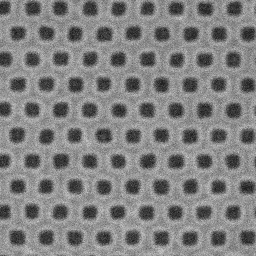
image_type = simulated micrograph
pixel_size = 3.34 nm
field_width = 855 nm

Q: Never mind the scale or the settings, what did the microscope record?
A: a regular array of holes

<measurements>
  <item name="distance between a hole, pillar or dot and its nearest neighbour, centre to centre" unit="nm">94.8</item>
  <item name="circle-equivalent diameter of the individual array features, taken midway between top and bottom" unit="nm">56.5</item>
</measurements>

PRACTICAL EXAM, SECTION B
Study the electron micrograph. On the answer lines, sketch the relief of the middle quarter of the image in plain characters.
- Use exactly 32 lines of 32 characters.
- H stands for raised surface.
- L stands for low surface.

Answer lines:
LHHHHLLLHHHHLLLHHHHLLLLHHHLLLLHH
HHHHHHHHHHHHHHHHHHHHHHHHHHHHHHHH
HHHHHHHHHHHHHHHHHHHHHHHHHHHHHHHH
HHLLHHHHLLLHHHHHLLLHHHHLLLHHHHLL
HLLLLHHHLLLLHHHLLLLHHHLLLLHHHLLL
HLLLLHHHLLLLHHHLLLLHHHLLLLHHHLLL
HLLLLHHHLLLHHHHLLLLHHHHLLLHHHHLL
HHHHHHHHHHHHHHHHHHHHHHHHHHHHHHHH
HHHHHHHHHHHHHHHHHHHHHHHHHHHHHHHH
HHHHHHHHHHHHHHHHHHHHHHHHHHHHHHHH
LHHHHLLLHHHHLLLLHHHLLLLHHHLLLLHH
LHHHLLLLLHHHLLLLHHHLLLLHHHLLLLHH
LHHHLLLLHHHHLLLLHHHLLLLHHHLLLLHH
HHHHHHLHHHHHHLLHHHHHLLHHHHHLLHHH
HHHHHHHHHHHHHHHHHHHHHHHHHHHHHHHH
HHHHHHHHHHHHHHHHHHHHHHHHHHHHHHHH
HLLLHHHHLLLLHHHHLLLHHHLLLLHHHHLL
LLLLLHHHLLLLHHHLLLLHHHLLLLLHHLLL
HLLLLHHHLLLLHHHLLLLHHHLLLLLHHLLL
HLLLHHHHLLLLHHHLLLLHHHHLLLHHHLLL
HHHHHHHHHHHHHHHHHHHHHHHHHHHHHHHH
HHHHHHHHHHHHHHHHHHHHHHHHHHHHHHHH
LHHHHHLHHHHHHLHHHHHHHLHHHHHLLHHH
LHHHLLLLLHHLLLLLHHHLLLLHHHLLLLHH
LHHHLLLLHHHLLLLLHHHLLLLHHHLLLLHH
LHHHLLLLHHHHLLLLHHHLLLLHHHLLLLHH
HHHHHHHHHHHHHHHHHHHHLLHHHHHHLHHH
HHHHHHHHHHHHHHHHHHHHHHHHHHHHHHHH
HHHHHHHHHHHHHHHHHHHHHHHHHHHHHHHH
HLLLLHHHLLLLHHHLLLLHHHLLLLHHHHLL
HLLLLHHHLLLLHHHLLLLHHHLLLLLHHHLL
HLLLLHHHLLLLHHHLLLLHHHLLLLLHHHLL